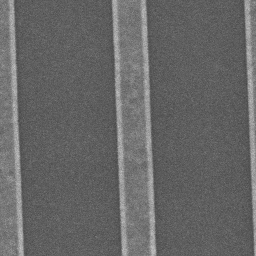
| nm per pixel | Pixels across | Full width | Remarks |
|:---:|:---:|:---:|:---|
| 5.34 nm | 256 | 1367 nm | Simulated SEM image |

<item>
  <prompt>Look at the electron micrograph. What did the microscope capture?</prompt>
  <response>one or a few lines or trenches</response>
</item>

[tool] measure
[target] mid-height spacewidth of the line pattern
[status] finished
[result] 0.548 micrometres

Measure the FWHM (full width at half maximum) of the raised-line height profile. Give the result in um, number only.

0.157